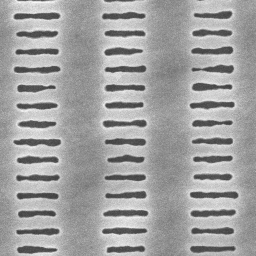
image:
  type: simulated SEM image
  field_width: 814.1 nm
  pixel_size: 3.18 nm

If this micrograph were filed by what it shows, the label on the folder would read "a regular array of holes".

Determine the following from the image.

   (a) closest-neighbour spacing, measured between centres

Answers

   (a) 57 nanometers